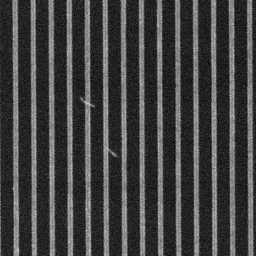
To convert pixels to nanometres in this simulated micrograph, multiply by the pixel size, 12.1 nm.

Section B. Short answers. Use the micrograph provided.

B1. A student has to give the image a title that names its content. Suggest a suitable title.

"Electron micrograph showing parallel lines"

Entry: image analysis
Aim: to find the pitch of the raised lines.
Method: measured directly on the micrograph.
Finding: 218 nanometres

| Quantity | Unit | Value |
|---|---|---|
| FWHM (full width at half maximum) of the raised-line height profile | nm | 46.9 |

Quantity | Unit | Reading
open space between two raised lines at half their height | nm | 169